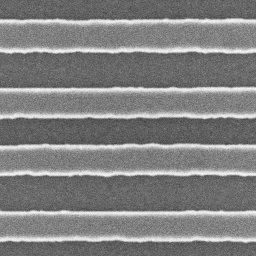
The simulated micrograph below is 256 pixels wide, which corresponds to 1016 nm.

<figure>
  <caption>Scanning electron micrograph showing lines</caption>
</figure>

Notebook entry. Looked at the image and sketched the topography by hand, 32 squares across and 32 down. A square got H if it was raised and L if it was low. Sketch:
LLLLLLLLLLLLLLLLLLLLLLLLLLLLLLLL
LLLLLLLLLLLLLLLLLLLLLLLLLLLLLLLL
LLLLLLLLLLLLLLLLLLLLHLLHLLLLHHHL
HHHHHHHHHHHHHHHHHHHHHHHHHHHHHHHH
HHHHHHHHHHHHHHHHHHHHHHHHHHHHHHHH
HHHHHHHHHHHHHHHHHHHHHHHHHHHHHHHH
LHHHLLHHLLLLLHHLLLLLHLLLLHLLHHHH
LLLLLLLLLLLLLLLLLLLLLLLLLLLLLLLL
LLLLLLLLLLLLLLLLLLLLLLLLLLLLLLLL
LLLLLLLLLLLLLLLLLLLLLLLLLLLLLLLL
LLLLLLLLLLLLLLLLLLLLLLLLLLLLLLLL
HHHHHHHHHHHHHHHHHHHHHHHHHHHHHHHH
HHHHHHHHHHHHHHHHHHHHHHHHHHHHHHHH
HHHHHHHHHHHHHHHHHHHHHHHHHHHHHHHH
HHHHHHHHHHHHHHHHHHHHHHHHHHHHHHHH
LLLLLLLLLLLLLLLLLLLLLLLLLLLLLLLL
LLLLLLLLLLLLLLLLLLLLLLLLLLLLLLLL
LLLLLLLLLLLLLLLLLLLLLLLLLLLLLLLL
HHHHHHHHHHHHHHHHHHHHHHHHHHHHHHHH
HHHHHHHHHHHHHHHHHHHHHHHHHHHHHHHH
HHHHHHHHHHHHHHHHHHHHHHHHHHHHHHHH
HHHHHHHHHHHHHHHHHHHHHHHHHHHHHHHH
LLLLLLLLLLLLLLLLLLLLLLLLLLLLLLLL
LLLLLLLLLLLLLLLLLLLLLLLLLLLLLLLL
LLLLLLLLLLLLLLLLLLLLLLLLLLLLLLLL
LLLLLLLLLLLLLLLLLLLLLLLLLLLLLLLL
LLLLHLLHHLLLLLLLLLLLLLLHHHHLLLLH
HHHHHHHHHHHHHHHHHHHHHHHHHHHHHHHH
HHHHHHHHHHHHHHHHHHHHHHHHHHHHHHHH
HHHHHHHHHHHHHHHHHHHHHHHHHHHHHHHH
LLLLLLLLLLLLLLLLLLLLLLLLLLLLLLLL
LLLLLLLLLLLLLLLLLLLLLLLLLLLLLLLL